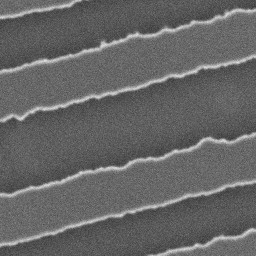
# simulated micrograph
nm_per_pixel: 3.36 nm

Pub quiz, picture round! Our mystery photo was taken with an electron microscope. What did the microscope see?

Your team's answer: lines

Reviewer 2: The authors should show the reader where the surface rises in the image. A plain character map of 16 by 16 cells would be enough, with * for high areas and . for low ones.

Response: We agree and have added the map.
****............
............****
.......*********
....************
************....
*********.......
*****...........
................
...............*
...........*****
.......*********
...************.
***********.....
*******.........
****...........*
............****